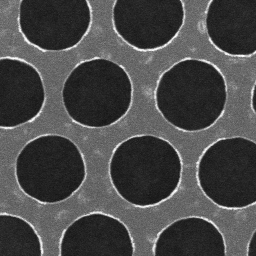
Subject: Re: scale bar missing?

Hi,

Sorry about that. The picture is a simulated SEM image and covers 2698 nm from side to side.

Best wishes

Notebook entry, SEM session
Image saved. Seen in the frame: holes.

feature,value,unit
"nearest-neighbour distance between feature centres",934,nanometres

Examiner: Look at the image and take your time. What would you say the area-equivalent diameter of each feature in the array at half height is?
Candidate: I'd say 730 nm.